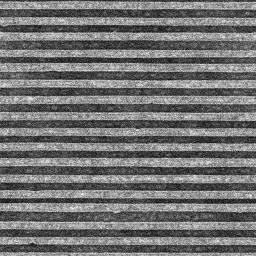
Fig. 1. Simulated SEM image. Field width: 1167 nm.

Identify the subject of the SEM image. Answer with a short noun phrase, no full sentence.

parallel lines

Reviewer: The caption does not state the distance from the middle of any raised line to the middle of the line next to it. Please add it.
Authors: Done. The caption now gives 0.0716 µm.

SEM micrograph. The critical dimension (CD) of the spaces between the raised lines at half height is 38.7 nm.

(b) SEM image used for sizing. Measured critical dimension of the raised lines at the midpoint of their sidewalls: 0.0348 µm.